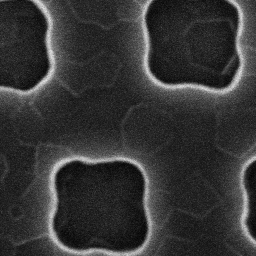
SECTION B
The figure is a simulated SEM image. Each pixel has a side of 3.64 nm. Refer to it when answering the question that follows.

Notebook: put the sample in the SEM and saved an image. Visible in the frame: holes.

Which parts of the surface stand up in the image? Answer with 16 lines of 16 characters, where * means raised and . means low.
...******......*
...******......*
...******......*
...******......*
...******......*
..***********.**
****************
****************
****************
****************
****.....******.
***......******.
***......******.
***......******.
***......******.
****.....*******